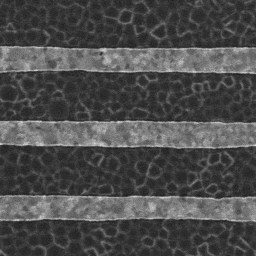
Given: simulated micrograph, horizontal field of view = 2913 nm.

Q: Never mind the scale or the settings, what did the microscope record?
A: one or a few lines or trenches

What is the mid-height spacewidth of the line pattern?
0.569 microns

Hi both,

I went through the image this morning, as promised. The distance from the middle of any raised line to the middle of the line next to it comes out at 843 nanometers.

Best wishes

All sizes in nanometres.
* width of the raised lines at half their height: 263